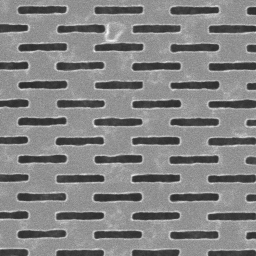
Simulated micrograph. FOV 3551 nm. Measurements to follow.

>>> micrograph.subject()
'a regular array of holes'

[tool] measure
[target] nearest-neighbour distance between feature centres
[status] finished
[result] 515 nm